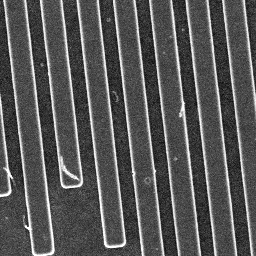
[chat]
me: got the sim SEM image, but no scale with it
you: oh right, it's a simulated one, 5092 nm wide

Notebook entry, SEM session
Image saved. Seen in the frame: parallel lines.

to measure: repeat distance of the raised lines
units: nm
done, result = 720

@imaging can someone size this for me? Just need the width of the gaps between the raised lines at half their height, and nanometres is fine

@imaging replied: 282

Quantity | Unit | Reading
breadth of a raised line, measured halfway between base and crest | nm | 430